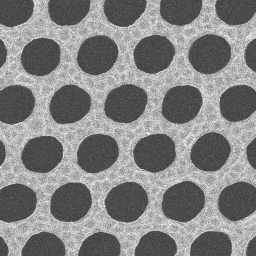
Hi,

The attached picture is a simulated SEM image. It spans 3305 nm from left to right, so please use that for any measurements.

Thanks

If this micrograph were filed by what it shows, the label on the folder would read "a regular array of holes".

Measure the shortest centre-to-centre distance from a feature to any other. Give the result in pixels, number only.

55.8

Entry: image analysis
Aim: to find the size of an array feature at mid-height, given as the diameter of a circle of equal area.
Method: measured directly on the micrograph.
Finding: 524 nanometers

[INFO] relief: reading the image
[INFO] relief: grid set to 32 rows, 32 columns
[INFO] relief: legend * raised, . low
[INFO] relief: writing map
....**.....**.....**.....**.....
....**.....**.....**.....**.....
...****...****...****...****...*
********************************
************.******.*****..*****
.**....***....***....***.....**.
.**.....**.....**.....**.....**.
.**....***.....**.....**.....**.
***....***....***....***....***.
********************************
********************************
....***....***....***....***....
....**.....**.....**.....**.....
....**.....**.....**.....**.....
....**.....**.....**....****...*
*.******.***********************
********************************
****...***....****...****...****
.**.....**.....**.....**.....**.
.**.....**.....**.....**.....**.
***....***....***....***....***.
****..*****.*******.************
********************************
....***....***....***....***....
....***....**.....**......*.....
.....*.....**.....**......*.....
....**.....**.....**.....***....
...****...****...*****..*****.**
********************************
****...****...****...****...****
.**.....**.....**.....**.....**.
.**.....**.....**.....**.....**.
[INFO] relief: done